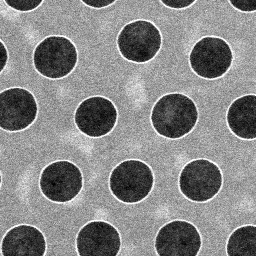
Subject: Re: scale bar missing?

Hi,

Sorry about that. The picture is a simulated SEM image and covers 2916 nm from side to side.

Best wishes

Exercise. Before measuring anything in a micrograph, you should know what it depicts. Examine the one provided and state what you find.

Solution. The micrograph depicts a regular array of holes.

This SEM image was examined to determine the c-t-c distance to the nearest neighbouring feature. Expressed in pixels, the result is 69.7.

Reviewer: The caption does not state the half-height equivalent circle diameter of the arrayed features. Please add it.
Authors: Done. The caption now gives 494 nanometers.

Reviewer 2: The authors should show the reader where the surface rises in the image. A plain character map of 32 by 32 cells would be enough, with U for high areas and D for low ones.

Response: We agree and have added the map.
UDDDDUUUUUUDDDUUUUUUDDDDUUUUUDDD
UUUUUUUUUUUUUUUUUUUUUUUUUUUUUUUU
UUUUUUUUUUUUUUUUUUUUUUUUUUUUUUUU
UUUUUUUUUUUUUUUDDDDDUUUUUUUUUUUU
UUUUUUUUUUUUUUUDDDDDUUUUUUUUUUUU
UUUUUDDDDUUUUUUDDDDDUUUUDDDDUUUU
DUUUDDDDDDUUUUUDDDDDUUUUDDDDDUUU
DUUUDDDDDDUUUUUUDDDUUUUUDDDDDUUU
DUUUDDDDDUUUUUUUUUUUUUUUDDDDDUUU
UUUUUDDDUUUUUUUUUUUUUUUUUDDDUUUU
UUUUUUUUUUUUUUUUUUUUUUUUUUUUUUUU
DDDDUUUUUUUUUUUUUUUUUUUUUUUUUUUU
DDDDUUUUUUUDDDUUUUUUDDDDUUUUUDDD
DDDDDUUUUUDDDDUUUUUDDDDDDUUUUDDD
DDDDDUUUUDDDDDDUUUUDDDDDDUUUDDDD
DDDDUUUUUDDDDDUUUUUDDDDDUUUUDDDD
UUUUUUUUUUDDDDUUUUUUDDDDUUUUUDDD
UUUUUUUUUUUUUUUUUUUUUUUUUUUUUUUU
UUUUUUUUUUUUUUUUUUUUUUUUUUUUUUUU
UUUUUUUUUUUUUUUUUUUUUUUUUUUUUUUU
UUUUUUDDDUUUUUUDDDUUUUUDDDDUUUUU
UUUUUDDDDDUUUUDDDDDUUUUDDDDDUUUU
UUUUUDDDDDUUUUDDDDDUUUDDDDDDUUUU
UUUUUDDDDDUUUUDDDDDUUUDDDDDDUUUU
UUUUUUDDDDUUUUDDDDUUUUUDDDDUUUUU
UUUUUUUUUUUUUUUUUUUUUUUUUUUUUUUU
UUUUUUUUUUUUUUUUUUUUUUUUUUUUUUUU
UUUUUUUUUUUUUUUUUUUUUUDUUUUUUUUU
UUDDUUUUUUDDDDUUUUUUDDDDDUUUUUDD
UDDDDUUUUUDDDDDUUUUUDDDDDUUUUDDD
DDDDDDUUUDDDDDDUUUUDDDDDDUUUDDDD
DDDDDDUUUUDDDDDUUUUUDDDDDUUUDDDD